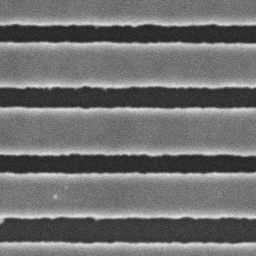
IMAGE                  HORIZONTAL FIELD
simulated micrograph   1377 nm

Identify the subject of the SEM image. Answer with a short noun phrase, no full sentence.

lines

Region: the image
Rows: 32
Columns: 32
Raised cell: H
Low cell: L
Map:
HHHHHHHHHHHHHHHHHHHHHHHHHHHHHHHH
HHHHHHHHHHHHHHHHHHHHHHHHHHHHHHHH
HHHHHHHHHHHHHHHHHHHHHHHHHHHHHHHH
LLLLLLLLLLLLLLLLLLLLLLLLLLLLLLLL
LLLLLLLLLLLLLLLLLLLLLLLLLLLLLLLL
HHHHHHHHHHHHHHHHHHHHHHHHLHLHLHHL
HHHHHHHHHHHHHHHHHHHHHHHHHHHHHHHH
HHHHHHHHHHHHHHHHHHHHHHHHHHHHHHHH
HHHHHHHHHHHHHHHHHHHHHHHHHHHHHHHH
HHHHHHHHHHHHHHHHHHHHHHHHHHHHHHHH
HHHHHHHHHHHHHHHHHHHHHHHHHHHHHHHH
LLLLLLLLLLLLLLLLLLLLLLLLLLLLLLLL
LLLLLLLLLLLLLLLLLLLLLLLLLLLLLLLL
LHHLLLLLLLLLHLHHHLLLLLLLLLLLLLLL
HHHHHHHHHHHHHHHHHHHHHHHHHHHHHHHH
HHHHHHHHHHHHHHHHHHHHHHHHHHHHHHHH
HHHHHHHHHHHHHHHHHHHHHHHHHHHHHHHH
HHHHHHHHHHHHHHHHHHHHHHHHHHHHHHHH
HHHHHHHHHHHHHHHHHHHHHHHHHHHHHHHH
LLLLLLLLLLLLLLLLLLLLLLLLLLLLLLLL
LLLLLLLLLLLLLLLLLLLLLLLLLLLLLLLL
LLLLLLLLLLLLLLLLLLLLLLLLLLLLLLLL
HHHHHHHHHHHHHHHHHHHHHHHHHHHHHHHH
HHHHHHHHHHHHHHHHHHHHHHHHHHHHHHHH
HHHHHHHHHHHHHHHHHHHHHHHHHHHHHHHH
HHHHHHHHHHHHHHHHHHHHHHHHHHHHHHHH
HHHHHHHHHHHHHHHHHHHHHHHHHHHHHHHH
LLLLLLLLLLLLLLLLLLLLLLLLLLLLLLLL
LLLLLLLLLLLLLLLLLLLLLLLLLLLLLLLL
LLLLLLLLLLLLLLLLLLLLLLLLLLLLLLLL
HHHHHHHHHHHHHHHHHHHHHHHHHHHLHLHH
HHHHHHHHHHHHHHHHHHHHHHHHHHHHHHHH